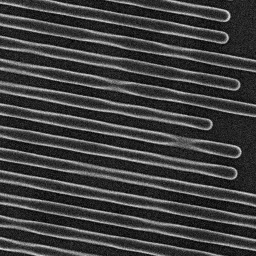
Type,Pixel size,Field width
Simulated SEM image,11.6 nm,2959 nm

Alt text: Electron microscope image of groups of lines, slits or small figures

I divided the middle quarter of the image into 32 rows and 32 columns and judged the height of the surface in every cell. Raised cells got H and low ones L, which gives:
LLLLLLLLLLLHHHHHHHHHHHHHHLLLLLLL
LLLLLLLLLLLLLLLHHHHHHHHHHHHHHHLL
HHHHHLLLLLLLLLLLLLLLHHHHHHHHHHHH
HHHHHHHHHLLLLLLLLLLLLLLLLHHHHHHH
LHHHHHHHHHHHHHLLLLLLLLLLLLLLLLLL
LLLLLLHHHHHHHHHHHHHHHHLLLLLLLLLL
LLLLLLLLLLLLLLHHHHHHHHHHHHHLLLLL
HHLLLLLLLLLLLLLLLHHHHHHHHHHHHHHH
HHHHHHHHLLLLLLLLLLLLLLHHHHHHHHHH
HHHHHHHHHHHHLLLLLLLLLLLLLLLLLHHH
LLLHHHHHHHHHHHHHLLLLLLLLLLLLLLLL
LLLLLLLLHHHHHHHHHHHHHHHLLLLLLLLL
LLLLLLLLLLLLLLLHHHHHHHHHHHHLLLLL
HHHHLLLLLLLLLLLLLLLLLHHHHHHHHHHH
HHHHHHHHHLLLLLLLLLLLLLLLLLHHHHHH
HHHHHHHHHHHHHHLLLLLLLLLLLLLLLLLL
LLLLLHHHHHHHHHHHHHHLLLLLLLLLLLLL
LLLLLLLLLLLLHHHHHHHHHHHHHLLLLLLL
HLLLLLLLLLLLLLLLLHHHHHHHHHHHHLLL
HHHHHHLLLLLLLLLLLLLLLLHHHHHHHHHH
HHHHHHHHHHHHLLLLLLLLLLLLLLLLLLHH
LLHHHHHHHHHHHHHHLLLLLLLLLLLLLLLL
LLLLLLLLHHHHHHHHHHHHHHLLLLLLLLLL
LLLLLLLLLLLLLLHHHHHHHHHHHHLLLLLL
HHHLLLLLLLLLLLLLLLLLHHHHHHHHHHHH
HHHHHHHLLLLLLLLLLLLLLLLLLHHHHHHH
HHHHHHHHHHHHLLLLLLLLLLLLLLLLLLLH
LLLLLLHHHHHHHHHHHHLLLLLLLLLLLLLL
LLLLLLLLLLLHHHHHHHHHHHHLLLLLLLLL
LLLLLLLLLLLLLLLLLHHHHHHHHHHHHHLL
HHHHLLLLLLLLLLLLLLLLLLHHHHHHHHHH
HHHHHHHHHHLLLLLLLLLLLLLLLLLHHHHH